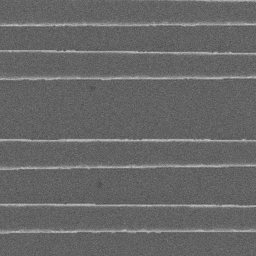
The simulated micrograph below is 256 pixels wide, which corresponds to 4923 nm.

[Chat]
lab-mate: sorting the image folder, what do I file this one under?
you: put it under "lines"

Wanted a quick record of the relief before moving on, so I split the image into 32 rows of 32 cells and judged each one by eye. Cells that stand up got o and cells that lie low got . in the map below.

oooooooooooooooooooooooooooooooo
oooooooooooooooooooooooooooooooo
oooooooooooooooooooooooooooooooo
................................
................................
................................
ooooooooooooooooo...............
oooooooooooooooooooooooooooooooo
oooooooooooooooooooooooooooooooo
oooooooooooooooooooooooooooooooo
................................
................................
................................
................................
................................
................................
................................
ooo........oo..o.....o..........
oooooooooooooooooooooooooooooooo
oooooooooooooooooooooooooooooooo
oooooooooooooooooooooooooooooooo
................................
................................
................................
................................
................................
oooooooooooooooooooooooooooooooo
oooooooooooooooooooooooooooooooo
oooooooooooooooooooooooooooooooo
................................
................................
................................